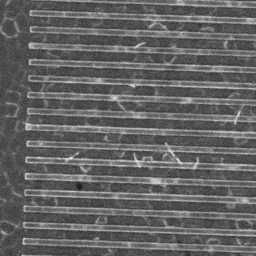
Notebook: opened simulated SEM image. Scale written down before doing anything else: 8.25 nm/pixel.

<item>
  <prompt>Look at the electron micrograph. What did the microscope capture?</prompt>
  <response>parallel lines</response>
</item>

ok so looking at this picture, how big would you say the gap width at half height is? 0.0897 micrometres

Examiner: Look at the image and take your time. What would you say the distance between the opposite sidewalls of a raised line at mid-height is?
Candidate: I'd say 0.0474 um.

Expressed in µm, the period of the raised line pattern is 0.134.